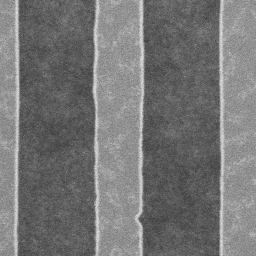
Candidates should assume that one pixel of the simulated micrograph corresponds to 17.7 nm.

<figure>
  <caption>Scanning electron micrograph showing one or a few lines or trenches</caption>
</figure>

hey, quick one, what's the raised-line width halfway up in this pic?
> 792 nm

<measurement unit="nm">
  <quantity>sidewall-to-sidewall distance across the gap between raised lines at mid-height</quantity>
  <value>1410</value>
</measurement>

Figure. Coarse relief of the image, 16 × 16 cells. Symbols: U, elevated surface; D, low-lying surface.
UDDDDDUUUDDDDDUU
UDDDDDUUUDDDDDUU
UDDDDDUUUDDDDDUU
UDDDDDUUUDDDDDUU
UDDDDDUUUDDDDDUU
UDDDDDUUUDDDDDUU
UDDDDDUUUDDDDDUU
UDDDDDUUUDDDDDUU
UDDDDDUUUDDDDDUU
UDDDDDUUUDDDDDUU
UDDDDDUUUDDDDDUU
UDDDDDUUUDDDDDUU
UDDDDDUUUDDDDDUU
UDDDDDUUUDDDDDUU
UDDDDDUUUDDDDDUU
UDDDDDUUUDDDDDUU